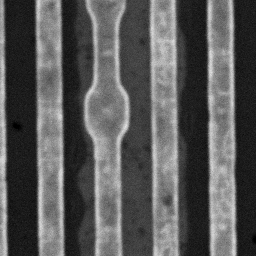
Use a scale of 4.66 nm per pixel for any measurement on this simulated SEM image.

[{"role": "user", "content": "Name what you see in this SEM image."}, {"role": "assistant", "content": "wiring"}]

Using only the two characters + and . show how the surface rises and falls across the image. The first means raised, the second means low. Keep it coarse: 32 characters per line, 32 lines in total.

.....++....++++....+++....+++...
.....++....++++....+++....+++...
.....++.....+++....+++....+++...
.....++.....+++....++.....+++...
.....++.....+++....+++....+++...
.....++.....+++....+++....+++...
.....++.....+++....+++....+++...
.....++.....+++....++.....+++...
.....++.....+++....+++....+++...
.....++.....+++....+++....+++...
.....++.....+++....+++....+++...
.....++....++++....+++....+++...
.....++....+++++...++.....+++...
.....++....+++++...++.....+++...
.....++....+++++...+++....+++...
.....++....+++++...+++....+++...
.....++.....+++....+++....+++...
.....++.....+++....+++....+++...
.....+++....+++....+++....+++...
.....+++....+++....+++....+++...
.....+++....+++....+++.....++...
.....+++....+++....+++.....++...
.....+++....++.....+++....+++...
+....+++....+++....+++....+++...
+....+++....+++....+++.....++...
+....+++....+++....+++.....++...
+....+++....+++....+++.....++...
+....+++....+++.....++.....++...
+....+++....+++.....+......++...
+.....++....+++.....++.....++...
+....+++....+++.....++.....++...
+....++.....+++....+++.....++...